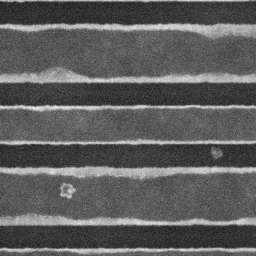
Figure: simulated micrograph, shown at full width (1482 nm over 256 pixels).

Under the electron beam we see lines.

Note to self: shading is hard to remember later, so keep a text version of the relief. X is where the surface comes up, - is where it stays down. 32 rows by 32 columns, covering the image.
--------------------------------
--------------------------------
--------------------------------
XXXXXXXXXXXXXXXXXXXXXXXXX---X---
XXXXXXXXXXXXXXXXXXXXXXXXXXXXXXXX
XXXXXXXXXXXXXXXXXXXXXXXXXXXXXXXX
XXXXXXXXXXXXXXXXXXXXXXXXXXXXXXXX
XXXXXXXXXXXXXXXXXXXXXXXXXXXXXXXX
XXXXXXXXXXXXXXXXXXXXXXXXXXXXXXXX
XXXXXXXXXXXXXXXXXXXXXXXXXXXXXXXX
--------------------------------
--------------------------------
--------------------------------
XXXXXXXXXXXXXXXXXXXXXXXXXXXXXXXX
XXXXXXXXXXXXXXXXXXXXXXXXXXXXXXXX
XXXXXXXXXXXXXXXXXXXXXXXXXXXXXXXX
XXXXXXXXXXXXXXXXXXXXXXXXXXXXXXXX
XXXXXXXXXXXXXXXXXXXXXXXXXXXXXXXX
--------------------------------
--------------------------------
--------------------------------
XXXXXXXXXXXXXXXXX-XXXXXXXXXXXXXX
XXXXXXXXXXXXXXXXXXXXXXXXXXXXXXXX
XXXXXXXXXXXXXXXXXXXXXXXXXXXXXXXX
XXXXXXXXXXXXXXXXXXXXXXXXXXXXXXXX
XXXXXXXXXXXXXXXXXXXXXXXXXXXXXXXX
XXXXXXXXXXXXXXXXXXXXXXXXXXXXXXXX
XXXXXXXXXXXXXXXXXXXXXXXXXXXXXXXX
--------------------------------
--------------------------------
--------------------------------
XXXXXXXXXXXXXXXXXXXXXXXXXXXXXXXX